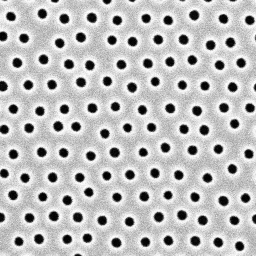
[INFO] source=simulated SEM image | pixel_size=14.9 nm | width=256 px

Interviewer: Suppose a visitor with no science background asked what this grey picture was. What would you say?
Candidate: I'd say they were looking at a regular array of holes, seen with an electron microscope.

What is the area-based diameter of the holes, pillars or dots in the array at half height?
156 nanometers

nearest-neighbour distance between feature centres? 328 nm